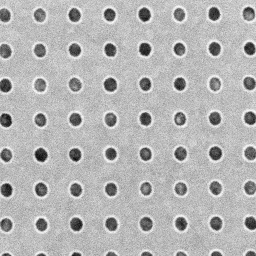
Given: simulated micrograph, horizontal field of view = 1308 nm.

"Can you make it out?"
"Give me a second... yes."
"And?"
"a regular array of holes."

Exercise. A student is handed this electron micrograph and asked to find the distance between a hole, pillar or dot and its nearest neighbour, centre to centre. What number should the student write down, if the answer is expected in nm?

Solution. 176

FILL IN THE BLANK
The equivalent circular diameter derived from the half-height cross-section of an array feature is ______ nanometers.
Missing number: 74.9